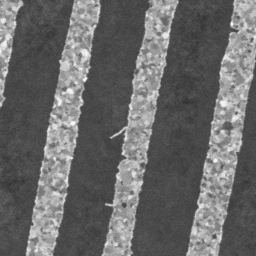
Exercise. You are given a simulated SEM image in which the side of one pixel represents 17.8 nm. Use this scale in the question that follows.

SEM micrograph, one or a few lines or trenches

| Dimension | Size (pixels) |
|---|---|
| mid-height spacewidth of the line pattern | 52.7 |